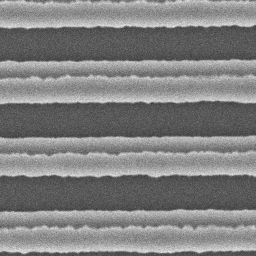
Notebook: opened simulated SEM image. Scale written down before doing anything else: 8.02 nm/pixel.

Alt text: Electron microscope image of lines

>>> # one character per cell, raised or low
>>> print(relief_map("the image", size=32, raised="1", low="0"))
11111111111111111111111111111111
11111111111111111111111111111111
11111111111111111111111111111111
00010000000000000000000000000000
00000000000000000000000000000000
00000000000000000000000000000000
00000000000000000000000000000000
00000000000000000000000000000100
11111111111111111111111111111111
11111111111111111111111111111111
11111111111111111111111111111111
11111111111111111111111111111111
11111111111111111111111110111111
00000000000000000000000000000000
00000000000000000000000000000000
00000000000000000000000000000000
00000000000000000000000000000000
11111111111111111111111111111111
11111111111111111111111111111111
11111111111111111111111111111111
11111111111111111111111111111111
11111111111111111111111111111111
00000000000000000000000000000000
00000000000000000000000000000000
00000000000000000000000000000000
00000000000000000000000000000000
11001111111111111111111111111111
11111111111111111111111111111111
11111111111111111111111111111111
11111111111111111111111111111111
11111111111111111111111111111111
00010011100000000111110000000000